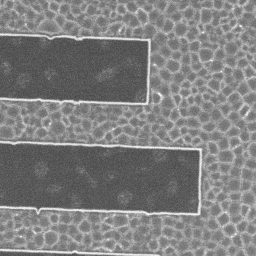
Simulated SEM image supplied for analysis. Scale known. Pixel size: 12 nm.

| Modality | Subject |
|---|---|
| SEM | one or a few lines or trenches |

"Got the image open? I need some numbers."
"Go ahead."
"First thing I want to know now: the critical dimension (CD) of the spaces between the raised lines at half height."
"512 nm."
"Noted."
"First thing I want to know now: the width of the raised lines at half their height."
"785 nanometers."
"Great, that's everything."